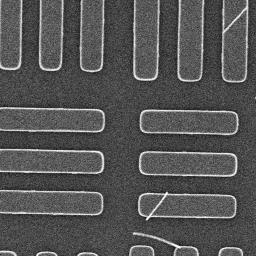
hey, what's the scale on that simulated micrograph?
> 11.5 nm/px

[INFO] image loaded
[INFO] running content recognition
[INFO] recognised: groups of lines, slits or small figures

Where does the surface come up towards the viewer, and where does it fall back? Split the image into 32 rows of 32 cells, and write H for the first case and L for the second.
HHHLLHHHLLHHHLLLLHHHLLHHHLLLHHHL
HHHLLHHHLLHHHLLLLHHHLLHHHLLLHHHL
HHHLLHHHLLHHHLLLLHHHLLHHHLLLHHHL
HHHLLHHHLLHHHLLLLHHHLLHHHLLLHHHL
HHHLLHHHLLHHHLLLLHHHLLHHHLLLHHHL
HHHLLHHHLLHHHLLLLHHHLLHHHLLLHHHL
HHHLLHHHLLHHHLLLLHHHLLHHHLLLHHHL
HHHLLHHHLLHHHLLLLHHHLLHHHLLLHHHL
HHLLLHHLLLHHHLLLLHHHLLHHHLLLHHHL
LLLLLLLLLLLLLLLLLHHHLLHHHLLLHHHL
LLLLLLLLLLLLLLLLLLLLLLLLLLLLLLLL
LLLLLLLLLLLLLLLLLLLLLLLLLLLLLLLL
LLLLLLLLLLLLLLLLLLLLLLLLLLLLLLLL
LLLLLLLLLLLLLLLLLLLLLLLLLLLLLLLL
HHHHHHHHHHHHHLLLLLHHHHHHHHHHHHLL
HHHHHHHHHHHHHLLLLLHHHHHHHHHHHHLL
LLLLLLLLLLLLLLLLLLHHHHHHHHHHHLLL
LLLLLLLLLLLLLLLLLLLLLLLLLLLLLLLL
LLLLLLLLLLLLLLLLLLLLLLLLLLLLLLLL
HHHHHHHHHHHHHLLLLLHHHHHHHHHHHLLL
HHHHHHHHHHHHHLLLLHHHHHHHHHHHHHLL
LLLLLLHHHHHHLLLLLLHHHHHHHHHHHLLL
LLLLLLLLLLLLLLLLLLLLLLLLLLLLLLLL
LLLLLLLLLLLLLLLLLLLLLLLLLLLLLLLL
HHHHHHHHHHHHHLLLLLHHHHHHHHHHHLLL
HHHHHHHHHHHHHLLLLHHHHHHHHHHHHLLL
HHHHHHHHHHHHHLLLLHHHHHHHHHHHHLLL
LLLLLLLLLLLLLLLLLLLLLLLLLLLLLLLL
LLLLLLLLLLLLLLLLLLLLLLLLLLLLLLLL
LLLLLLLLLLLLLLLLLLLLLLLLLLLLLLLL
LLLLLLLLLLLLLLLLLLLLLLLLLLLLLLLL
HLLLLLLLLLLLLLLLHHHLLLHHHLLLHHLL